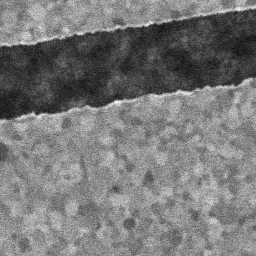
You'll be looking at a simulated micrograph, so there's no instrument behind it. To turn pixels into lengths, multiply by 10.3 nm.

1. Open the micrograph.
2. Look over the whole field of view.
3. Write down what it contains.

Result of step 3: one or a few lines or trenches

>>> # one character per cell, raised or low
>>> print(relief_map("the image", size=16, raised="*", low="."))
****************
*********.......
***.............
................
................
.............***
.......*********
.***************
****************
****************
****************
****************
****************
****************
****************
****************